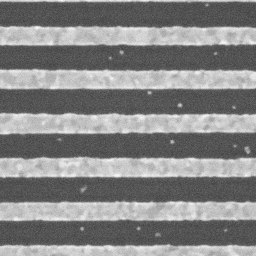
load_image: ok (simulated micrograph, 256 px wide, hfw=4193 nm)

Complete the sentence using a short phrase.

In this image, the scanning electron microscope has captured lines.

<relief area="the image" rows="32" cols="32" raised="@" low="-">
--------------------------------
--------------------------------
--------------------------------
@@@@@@@@@@@@@@@@@@@@@@@@@-@@@@@@
@@@@@@@@@@@@@@@@@@@@@@@@@@@@@@@@
@@@@@@@@@@@@@@@-@@@@@@@@@@@--@--
--------------------------------
--------------------------------
--------------------------------
@@@@@@@@@@@@@@@@@@@@@@@@@@@@@@@@
@@@@@@@@@@@@@@@@@@@@@@@@@@@@@@@@
--------------------------------
--------------------------------
--------------------------------
@@@@@@@@@@@@@@@-@@-@@@@@@@@@@@@@
@@@@@@@@@@@@@@@@@@@@@@@@@@@@@@@@
@@@@@@@@@@@@@@@@-@@-@-----------
--------------------------------
--------------------------------
--------------------------------
@@@@@@@@@@@@@@@@@@@@@@@@@@@@@@@@
@@@@@@@@@@@@@@@@@@@@@@@@@@@@@@@@
--------------------------------
--------------------------------
--------------------------------
@@@@@@@@@@@@@@@@@@@@@@@@@@@@@@@@
@@@@@@@@@@@@@@@@@@@@@@@@@@@@@@@@
--------------------------------
--------------------------------
--------------------------------
--------------------------------
@@@@@@@@@@@@@@@@@@@@@@@@@@@@@@@@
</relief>